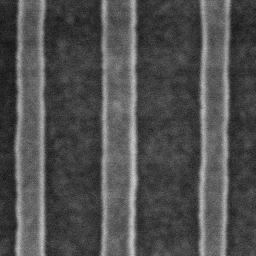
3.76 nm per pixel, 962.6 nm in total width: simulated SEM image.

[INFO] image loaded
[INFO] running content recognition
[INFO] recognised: lines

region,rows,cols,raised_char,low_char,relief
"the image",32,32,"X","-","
--XXX--------XXXX--------XXXX---
--XXX--------XXXX--------XXXX---
--XXX--------XXXX--------XXXX---
--XXX--------XXXX--------XXXX---
--XXX--------XXXX--------XXXX---
--XXX--------XXXX--------XXXX---
--XXX--------XXXX--------XXX----
--XXX--------XXXX--------XXX----
--XXX--------XXXX--------XXX----
--XXX--------XXXX--------XXX----
--XXX--------XXXX--------XXX----
--XXX--------XXXX--------XXX----
--XXX--------XXXX--------XXXX---
--XXX--------XXXX--------XXX----
--XXX--------XXXX--------XXX----
--XXX--------XXXX--------XXX----
--XXX--------XXXX--------XXX----
--XXX--------XXXX--------XXX----
--XXX--------XXXX--------XXX----
--XXX--------XXXX--------XXX----
--XXX--------XXXX--------XXX----
--XXX--------XXXX--------XXX----
--XXX--------XXXX--------XXX----
--XXX--------XXXX--------XXX----
--XXX--------XXXX--------XXX----
--XXX--------XXXX--------XXX----
--XXX--------XXXX--------XXX----
--XXX--------XXXX--------XXX----
--XXX--------XXXX--------XXX----
--XXX--------XXXX--------XXX----
--XXX--------XXXX--------XXX----
--XXX--------XXXX--------XXX----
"